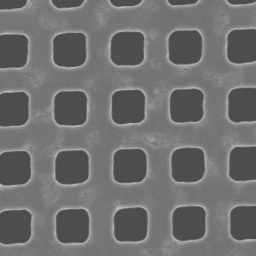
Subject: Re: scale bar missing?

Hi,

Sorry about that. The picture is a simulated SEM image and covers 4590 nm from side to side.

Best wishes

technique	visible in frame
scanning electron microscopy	a regular array of holes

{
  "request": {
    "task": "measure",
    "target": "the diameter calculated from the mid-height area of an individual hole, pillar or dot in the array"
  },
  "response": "0.656 micrometres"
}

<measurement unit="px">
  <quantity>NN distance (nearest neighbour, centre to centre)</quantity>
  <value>57.8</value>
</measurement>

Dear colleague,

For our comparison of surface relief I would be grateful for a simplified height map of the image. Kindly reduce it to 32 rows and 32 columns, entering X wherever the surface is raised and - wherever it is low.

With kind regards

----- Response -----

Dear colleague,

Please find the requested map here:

---XXXX---XXXX---XXXX---XXXXX--X
XXXXXXXXXXXXXXXXXXXXXXXXXXXXXXXX
XXXXXXXXXXXXXXXXXXXXXXXXXXXXXXXX
XXXXXXXXXXXXXXXXXXXXXXXXXXXXXXXX
---XXXX----XXX----XXX----XXX----
----XXX----XXX----XXX----XXX----
---XXXX----XXX----XXX----XXX----
---XXXX----XXX----XXX----XXXX---
-XXXXXXXXXXXXXXXXXXXXXXXXXXXXXXX
XXXXXXXXXXXXXXXXXXXXXXXXXXXXXXXX
XXXXXXXXXXXXXXXXXXXXXXXXXXXXXXXX
XX-XXXX---XXXX----XXXX---XXXX---
----XXX----XXX----XXX----XXX----
----XXX----XXX----XXX----XXX----
----XXX----XXX----XXX----XXXX---
---XXXX---XXXXX-XXXXXXXXXXXXXXXX
XXXXXXXXXXXXXXXXXXXXXXXXXXXXXXXX
XXXXXXXXXXXXXXXXXXXXXXXXXXXXXXXX
XXXXXXXXXXXXXXXXXXXXXXX--XXXX---
----XXX----XXX----XXXX---XXXX---
----XXX----XXX----XXX-----XXX---
----XXX----XXX----XXX-----XXX---
----XXX----XXX----XXXX---XXXX---
XXXXXXXXXXXXXXXXXXXXXXXXXXXXXXXX
XXXXXXXXXXXXXXXXXXXXXXXXXXXXXXXX
XXXXXXXXXXXXXXXXXXXXXXXXXXXXXXXX
---XXXX----XXXX---XXXX----XXX---
----XXX----XXX-----XX-----XXX---
----XXX----XXX----XXX-----XXX---
----XXX----XXX----XXXX---XXXX---
--XXXXXXXXXXXXXXXXXXXXXXXXXXXXXX
XXXXXXXXXXXXXXXXXXXXXXXXXXXXXXXX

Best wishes